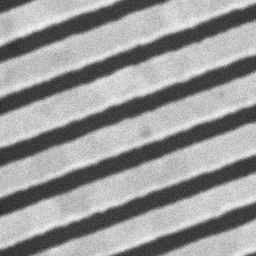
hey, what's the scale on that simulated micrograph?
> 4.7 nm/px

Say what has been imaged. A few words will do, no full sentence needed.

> lines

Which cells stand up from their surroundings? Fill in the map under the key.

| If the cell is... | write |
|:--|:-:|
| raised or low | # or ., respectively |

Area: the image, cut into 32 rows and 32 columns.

...###########......###########.
.##########......###########....
########.......###########......
######......############......##
###......###########.......#####
.......###########......########
....###########.......##########
.############......###########..
##########......###########.....
#######.......##########.......#
####.......###########......####
##......###########.......######
......##########.......#########
...##########.......##########..
###########......###########....
########.......##########.......
######......##########.......###
###.......##########......######
.......##########......#########
....##########.......##########.
.###########......###########...
#########.......##########......
######.......##########.......##
###.......##########.......#####
.......###########......########
.....##########.......#########.
..##########.......#########....
##########......##########......
#######.......#########.......##
####.......#########.......#####
##......##########......########
.....##########......###########